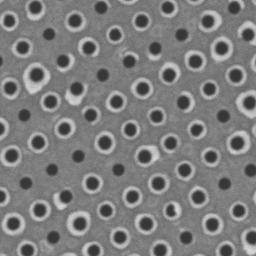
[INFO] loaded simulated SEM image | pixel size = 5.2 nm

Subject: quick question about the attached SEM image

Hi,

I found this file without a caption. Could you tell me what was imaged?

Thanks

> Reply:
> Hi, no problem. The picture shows a regular array of holes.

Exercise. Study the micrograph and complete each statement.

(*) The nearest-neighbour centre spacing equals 153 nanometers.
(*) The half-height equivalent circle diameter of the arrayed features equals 0.0637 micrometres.